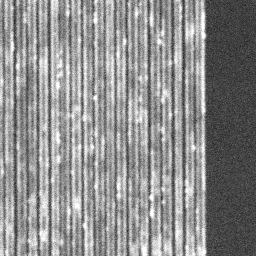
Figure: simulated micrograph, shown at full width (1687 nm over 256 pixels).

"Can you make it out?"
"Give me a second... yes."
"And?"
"parallel lines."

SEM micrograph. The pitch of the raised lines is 74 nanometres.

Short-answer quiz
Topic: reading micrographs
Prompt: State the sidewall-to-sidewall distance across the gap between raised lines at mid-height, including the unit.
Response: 26.3 nm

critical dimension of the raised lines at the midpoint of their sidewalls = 0.0477 micrometres